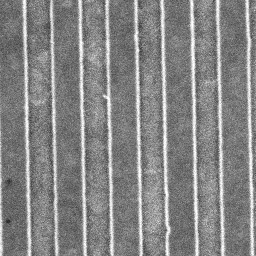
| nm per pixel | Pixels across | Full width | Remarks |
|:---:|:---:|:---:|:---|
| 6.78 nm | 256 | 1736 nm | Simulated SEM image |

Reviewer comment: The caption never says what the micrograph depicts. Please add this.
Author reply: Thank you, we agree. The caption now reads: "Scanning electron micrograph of parallel lines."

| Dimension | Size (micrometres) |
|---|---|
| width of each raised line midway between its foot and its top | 0.204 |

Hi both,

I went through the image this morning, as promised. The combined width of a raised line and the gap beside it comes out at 377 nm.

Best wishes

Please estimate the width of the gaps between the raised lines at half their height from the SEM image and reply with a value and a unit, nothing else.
0.176 µm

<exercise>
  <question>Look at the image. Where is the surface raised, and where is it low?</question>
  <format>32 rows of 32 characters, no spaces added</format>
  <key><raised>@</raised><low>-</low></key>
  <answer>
@@@---@@@@---@@@@---@@@@---@@@@-
@@@---@@@@---@@@@---@@@@---@@@@-
@@@---@@@@---@@@@---@@@@---@@@@-
@@@---@@@@---@@@@---@@@@---@@@@-
@@@---@@@@---@@@@---@@@@---@@@@-
@@@----@@@----@@@---@@@@---@@@@-
@@@----@@@---@@@@---@@@@---@@@@-
@@@----@@@---@@@@---@@@@---@@@@-
@@@----@@@----@@@---@@@@---@@@@-
@@@----@@@----@@@----@@@---@@@@-
@@@----@@@----@@@----@@@---@@@@-
@@@----@@@----@@@---@@@@----@@@-
@@@----@@@----@@@----@@@----@@@-
@@@----@@@----@@@----@@@---@@@@-
@@@----@@@----@@@----@@@---@@@@-
@@@----@@@----@@@----@@@----@@@-
@@@----@@@----@@@----@@@----@@@-
@@@----@@@----@@@----@@@----@@@-
@@@----@@@----@@@----@@@----@@@-
@@@----@@@----@@@----@@@----@@@-
@@@----@@@----@@@----@@@----@@@-
@@@----@@@----@@@----@@@----@@@-
@@@@---@@@----@@@----@@@----@@@-
@@@@---@@@----@@@----@@@----@@@-
@@@@---@@@----@@@@---@@@----@@@-
@@@@---@@@@---@@@@---@@@----@@@-
@@@@---@@@@---@@@@---@@@----@@@@
@@@@---@@@@---@@@@---@@@----@@@-
@@@@---@@@@---@@@@---@@@@---@@@-
@@@@---@@@@---@@@@---@@@@---@@@-
@@@@---@@@@---@@@@---@@@@---@@@-
@@@@---@@@@---@@@@---@@@@---@@@@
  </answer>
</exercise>